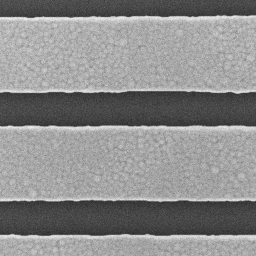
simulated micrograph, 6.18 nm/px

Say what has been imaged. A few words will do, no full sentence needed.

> lines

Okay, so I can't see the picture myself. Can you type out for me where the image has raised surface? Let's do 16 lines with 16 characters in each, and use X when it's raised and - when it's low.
----------------
XXXXXXXXXXXXXXXX
XXXXXXXXXXXXXXXX
XXXXXXXXXXXXXXXX
XXXXXXXXXXXXXXXX
XXXXXXXXXXXXXXXX
----------------
----------------
XXXXXXXXXXXXXXXX
XXXXXXXXXXXXXXXX
XXXXXXXXXXXXXXXX
XXXXXXXXXXXXXXXX
XXXXX----XXXXXXX
----------------
----------------
XXXXXXXXXXXXXXXX